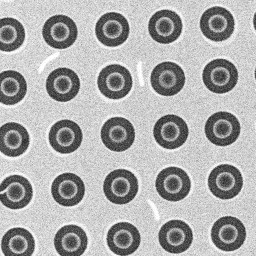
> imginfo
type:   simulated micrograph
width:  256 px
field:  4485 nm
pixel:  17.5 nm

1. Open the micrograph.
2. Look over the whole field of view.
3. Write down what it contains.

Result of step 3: an array of small figures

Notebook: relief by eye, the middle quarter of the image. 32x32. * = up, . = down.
**********.....********......***
..*******.......******........**
...******...**...*****...**...**
*...****...****..****...****..**
**..****...****..****...***...**
**..****...****..*****...*....**
*...*****...**...*****.......***
...******.......*******.....****
...*******.....*****************
.*******************************
********************************
********************************
**************************.*****
***********....*********......**
...*******.......******........*
....******.......******..***...*
**..*****...***...****..*****..*
**...****...***...****...****..*
**...****...***...****...***...*
**..*****........******.......**
....******.......*******.....***
...********.....**********..****
.*******************************
********************************
********************************
**************************..****
*************....*******......**
...********.......*****........*
....******........*****...***...
**...*****..****...****..****...
***..*****..****...****..****...
***..*****..****...****..****...